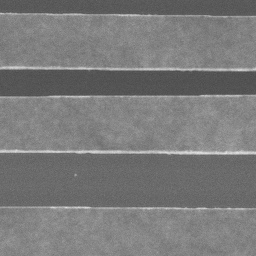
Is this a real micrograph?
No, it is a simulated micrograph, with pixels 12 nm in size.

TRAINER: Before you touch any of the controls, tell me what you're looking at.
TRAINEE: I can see lines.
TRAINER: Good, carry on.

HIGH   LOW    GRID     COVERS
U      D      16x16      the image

DDDDDDDDDDDDDDDD
UUUUUUUUUUUUUUUU
UUUUUUUUUUUUUUUU
UUUUUUUUUUUUUUUU
DDDDDDDDDDDDDDDD
DDDDDDDDDDDDDDDD
UUUUUUUUUUUUUUUU
UUUUUUUUUUUUUUUU
UUUUUUUUUUUUUUUU
UUUUUUUUUUUUUUUU
DDDDDDDDDDDDDDDD
DDDDDDDDDDDDDDDD
DDDDDDDDDDDDDDDD
UUUUUUUUUUUUUUUU
UUUUUUUUUUUUUUUU
UUUUUUUUUUUUUUUU